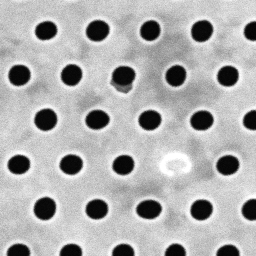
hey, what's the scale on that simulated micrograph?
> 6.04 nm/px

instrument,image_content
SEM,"a regular array of holes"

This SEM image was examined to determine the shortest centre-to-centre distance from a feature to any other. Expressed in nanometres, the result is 311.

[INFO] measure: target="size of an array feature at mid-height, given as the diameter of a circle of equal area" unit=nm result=136